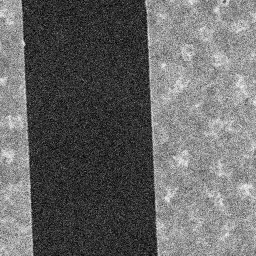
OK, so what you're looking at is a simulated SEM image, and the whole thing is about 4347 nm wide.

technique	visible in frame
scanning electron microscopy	one or a few lines or trenches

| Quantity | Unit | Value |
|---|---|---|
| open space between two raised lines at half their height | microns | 2.12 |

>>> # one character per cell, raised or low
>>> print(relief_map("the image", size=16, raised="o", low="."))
o........ooooooo
o........ooooooo
o........ooooooo
o........ooooooo
oo.......ooooooo
oo.......ooooooo
oo.......ooooooo
oo.......ooooooo
oo........oooooo
oo........oooooo
oo........oooooo
oo........oooooo
oo........oooooo
oo........oooooo
oo........oooooo
oo........oooooo